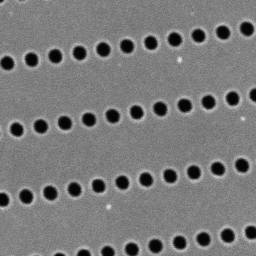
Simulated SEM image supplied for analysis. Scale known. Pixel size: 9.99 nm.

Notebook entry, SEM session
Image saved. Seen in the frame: a regular array of holes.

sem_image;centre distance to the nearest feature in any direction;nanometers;240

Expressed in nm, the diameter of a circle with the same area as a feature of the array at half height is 145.